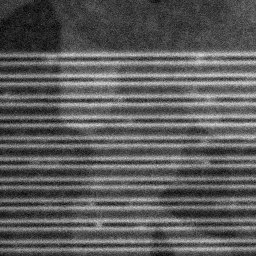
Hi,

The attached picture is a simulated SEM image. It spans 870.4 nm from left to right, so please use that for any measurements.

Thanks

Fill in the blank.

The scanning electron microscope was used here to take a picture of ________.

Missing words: parallel lines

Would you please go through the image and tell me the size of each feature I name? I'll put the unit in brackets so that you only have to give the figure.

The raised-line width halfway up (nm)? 48.9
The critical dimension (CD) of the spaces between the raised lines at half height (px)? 5.88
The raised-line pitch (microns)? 0.0705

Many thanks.